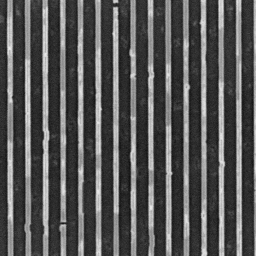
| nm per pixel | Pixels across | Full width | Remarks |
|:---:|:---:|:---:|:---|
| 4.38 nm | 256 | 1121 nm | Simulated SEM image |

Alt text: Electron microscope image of parallel lines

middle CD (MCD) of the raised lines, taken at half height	0.0219	micrometres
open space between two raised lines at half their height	56.3	nanometres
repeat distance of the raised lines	77.1	nanometers